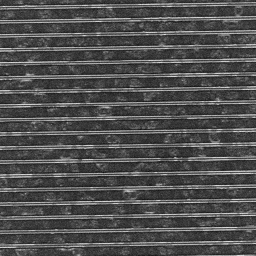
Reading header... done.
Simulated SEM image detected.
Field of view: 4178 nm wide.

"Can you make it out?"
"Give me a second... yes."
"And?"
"parallel lines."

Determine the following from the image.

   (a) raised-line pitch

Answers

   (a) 14 pixels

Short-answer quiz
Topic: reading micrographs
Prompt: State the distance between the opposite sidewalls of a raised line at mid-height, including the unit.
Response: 44.9 nm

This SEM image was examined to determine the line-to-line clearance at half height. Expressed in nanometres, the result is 184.